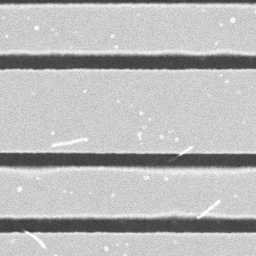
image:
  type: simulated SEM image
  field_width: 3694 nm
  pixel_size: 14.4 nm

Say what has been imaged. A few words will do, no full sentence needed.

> lines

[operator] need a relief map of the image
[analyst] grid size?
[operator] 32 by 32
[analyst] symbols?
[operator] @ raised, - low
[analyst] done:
-@-@@@@@@@@@@@@@@@@@@@@@@@@@@@@@
@@@@@@@@@@@@@@@@@@@@@@@@@@@@@@@@
@@@@@@@@@@@@@@@@@@@@@@@@@@@@@@@@
@@@@@@@@@@@@@@@@@@@@@@@@@@@@@@@@
@@@@@@@@@@@@@@@@@@@@@@@@@@@@@@@@
@@@@@@@@@@@@@@@@@@@@@@@@@@@@@@@@
@@@@@@@@@@@@@@@@@@@@@@@@@@@@@@@@
--------------------------------
--------------------------------
@@@@@@@@@@@@@@@@@@@@@@@@@@@@@@@@
@@@@@@@@@@@@@@@@@@@@@@@@@@@@@@@@
@@@@@@@@@@@@@@@@@@@@@@@@@@@@@@@@
@@@@@@@@@@@@@@@@@@@@@@@@@@@@@@@@
@@@@@@@@@@@@@@@@@@@@@@@@@@@@@@@@
@@@@@@@@@@@@@@@@@@@@@@@@@@@@@@@@
@@@@@@@@@@@@@@@@@@@@@@@@@@@@@@@@
@@@@@@@@@@@@@@@@@@@@@@@@@@@@@@@@
@@@@@@@@@@@@@@@@@@@@@@@@@@@@@@@@
@@@@@@@@@@@@@@@@@@@@@@@@@@@@@@@@
--------------------------------
--------------------------------
@@@@@@@@@@@@@@@@@@@@@@@@@@@@@@@@
@@@@@@@@@@@@@@@@@@@@@@@@@@@@@@@@
@@@@@@@@@@@@@@@@@@@@@@@@@@@@@@@@
@@@@@@@@@@@@@@@@@@@@@@@@@@@@@@@@
@@@@@@@@@@@@@@@@@@@@@@@@@@@@@@@@
@@@@@@@@@@@@@@@@@@@@@@@@@@@@@@@@
--------------------------------
--------------------------------
@@@@@@@@@@@@@@@@@@@@@@@@@@@@@@@@
@@@@@@@@@@@@@@@@@@@@@@@@@@@@@@@@
@@@@@@@@@@@@@@@@@@@@@@@@@@@@@@@@